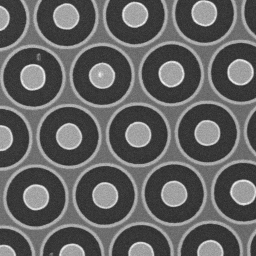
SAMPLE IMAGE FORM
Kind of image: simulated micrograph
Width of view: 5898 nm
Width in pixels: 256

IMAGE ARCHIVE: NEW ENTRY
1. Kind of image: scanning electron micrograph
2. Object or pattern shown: an array of small figures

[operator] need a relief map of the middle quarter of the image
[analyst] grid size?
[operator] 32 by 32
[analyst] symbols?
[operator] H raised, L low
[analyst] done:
HHLLLLLLHHHLLLLLLHHLLLLLLHHHHLLL
HHLLLLLHHHHHLLLLLHHLLLLLHHHHHHLL
HHLLLLLHHHHHLLLLLHHLLLLLHHHHHHLL
HHLLLLLHHHHHLLLLLHHLLLLLHHHHHHLL
HHLLLLLHHHHHLLLLLHHLLLLLHHHHHLLL
HHLLLLLLHHHLLLLLLHHHLLLLLLHHLLLL
HHHLLLLLLLLLLLLLHHHHLLLLLLLLLLLL
HHHLLLLLLLLLLLLLHHHHHLLLLLLLLLLL
HHHHLLLLLLLLLLLHHHHHHHLLLLLLLLLL
HHHHHLLLLLLLLLHHHHHHHHHLLLLLLLHH
LLLHHHHHLLLHHHHLLLLLLHHHHHHHHHHH
LLLLLHHHHHHHHHLLLLLLLLLHHHHHHHHL
LLLLLLLHHHHHHLLLLLLLLLLLHHHHHHLL
LLLLLLLHHHHHLLLLLLLLLLLLLHHHHLLL
LLLLLLLLHHHLLLLLLLLLLLLLLLHHHLLL
HHHLLLLLLHHLLLLLHHHHHLLLLLHHLLLL
HHHHLLLLLHHLLLLLHHHHHLLLLLHHLLLL
HHHHLLLLLHHLLLLLHHHHHHLLLLHHLLLL
HHHHLLLLLHHLLLLLHHHHHHLLLLHHLLLL
HHHHLLLLLHHLLLLLHHHHHLLLLLHHLLLL
HHHLLLLLLHHLLLLLLLHLLLLLLLHHHLLL
LLLLLLLLHHHHLLLLLLLLLLLLLHHHHLLL
LLLLLLLLHHHHHLLLLLLLLLLLLHHHHHLL
LLLLLLLHHHHHHLLLLLLLLLLLHHHHHHHL
LLLLLHHHHHHHHHHLLLLLLLLHHHHHHHHH
LLLHHHHHLLLLLHHHHHLHHHHHLLLLLLLH
HHHHHHLLLLLLLLLHHHHHHHHLLLLLLLLL
HHHHHLLLLLLLLLLLHHHHHHLLLLLLLLLL
HHHHLLLLLLLLLLLLLHHHHLLLLLLLLLLL
HHHLLLLLLLLLLLLLLHHHLLLLLLHHLLLL
HHHLLLLLHHHHLLLLLLHHLLLLLHHHHHLL
LHHLLLLLHHHHHLLLLLHHLLLLLHHHHHLL